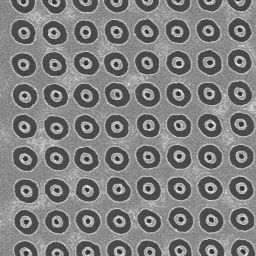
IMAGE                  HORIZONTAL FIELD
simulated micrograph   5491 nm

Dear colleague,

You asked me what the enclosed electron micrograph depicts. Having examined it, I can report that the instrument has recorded a regular array of ring-shaped grooves with a dot in the middle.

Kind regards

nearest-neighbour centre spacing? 652 nanometers